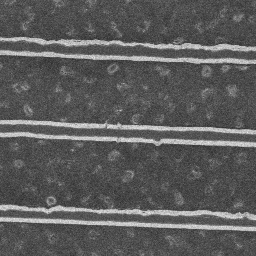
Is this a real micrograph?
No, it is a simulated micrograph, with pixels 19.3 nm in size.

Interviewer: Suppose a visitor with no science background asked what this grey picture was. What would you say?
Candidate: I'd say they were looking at one or a few lines or trenches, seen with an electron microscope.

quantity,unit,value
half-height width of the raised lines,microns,0.256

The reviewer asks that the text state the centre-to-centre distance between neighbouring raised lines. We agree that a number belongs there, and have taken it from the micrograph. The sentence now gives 1610 nm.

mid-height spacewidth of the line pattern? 1.33 microns